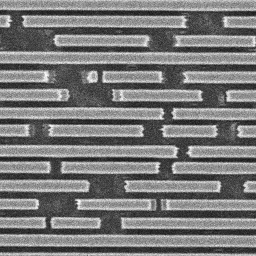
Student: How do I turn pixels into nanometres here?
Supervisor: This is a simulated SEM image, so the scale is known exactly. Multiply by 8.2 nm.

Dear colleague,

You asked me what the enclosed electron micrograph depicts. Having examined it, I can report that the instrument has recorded parallel lines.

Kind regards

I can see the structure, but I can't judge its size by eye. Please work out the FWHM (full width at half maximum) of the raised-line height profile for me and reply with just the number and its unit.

94.3 nanometres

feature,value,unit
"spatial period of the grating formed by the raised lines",150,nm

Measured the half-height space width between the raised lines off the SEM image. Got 0.0584 micrometres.